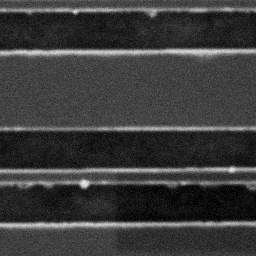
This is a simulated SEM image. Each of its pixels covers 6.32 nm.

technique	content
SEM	lines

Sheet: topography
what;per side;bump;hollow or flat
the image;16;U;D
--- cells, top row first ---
UUUUUUUUUUUUUUUU
DDDDDDDDDDDDDDDD
DDDDDDDDDDDDDDDD
UUUUUUUUUUUUUUUU
UUUUUUUUUUUUUUUU
UUUUUUUUUUUUUUUU
UUUUUUUUUUUUUUUU
UUUUUUUUUUUUUUUU
DDDDDDDDDDDDDDDD
DDDDDDDDDDDDDDDD
DDDDDDDDDDDDDDUD
DDDDDUDDDDDDDDDD
DDDDDDDDDDDDDDDD
DDDDDDDDDDDDDDDD
UUUUUUUUUUUUUUUU
UUUUUUUUUUUUUUUU